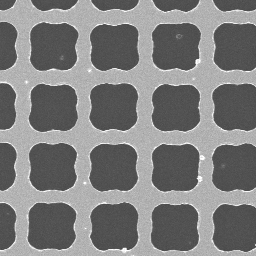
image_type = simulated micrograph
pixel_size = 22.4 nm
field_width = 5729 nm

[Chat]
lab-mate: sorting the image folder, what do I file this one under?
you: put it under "a regular array of holes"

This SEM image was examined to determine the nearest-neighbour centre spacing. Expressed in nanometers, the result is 1340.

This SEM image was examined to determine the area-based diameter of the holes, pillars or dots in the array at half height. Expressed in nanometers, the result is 1140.